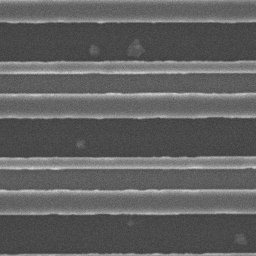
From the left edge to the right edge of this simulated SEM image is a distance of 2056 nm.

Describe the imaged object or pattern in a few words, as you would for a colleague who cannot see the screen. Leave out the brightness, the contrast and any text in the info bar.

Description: lines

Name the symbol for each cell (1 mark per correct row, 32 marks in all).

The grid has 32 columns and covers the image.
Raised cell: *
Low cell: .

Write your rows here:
********************************
********************************
********************************
................................
................................
................................
................................
................................
********************************
********************************
********************************
********************************
********************************
********************************
********************************
................................
................................
................................
................................
................................
********************************
********************************
********************************
********************************
********************************
********************************
********************************
................................
................................
................................
................................
................................